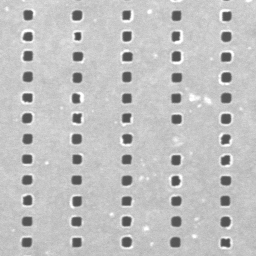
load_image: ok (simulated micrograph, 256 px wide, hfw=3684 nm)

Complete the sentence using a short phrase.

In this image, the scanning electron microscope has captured a regular array of holes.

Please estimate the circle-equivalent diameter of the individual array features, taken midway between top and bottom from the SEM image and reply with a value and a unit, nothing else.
165 nm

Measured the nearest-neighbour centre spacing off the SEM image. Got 293 nm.